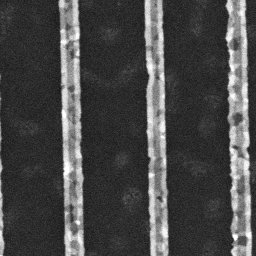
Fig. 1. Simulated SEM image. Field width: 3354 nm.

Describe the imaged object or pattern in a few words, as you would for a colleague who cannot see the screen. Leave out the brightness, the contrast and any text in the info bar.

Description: one or a few lines or trenches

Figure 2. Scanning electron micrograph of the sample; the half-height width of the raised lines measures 172 nm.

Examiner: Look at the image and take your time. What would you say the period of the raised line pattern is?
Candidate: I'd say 1100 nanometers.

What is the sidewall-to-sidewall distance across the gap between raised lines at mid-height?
0.928 um